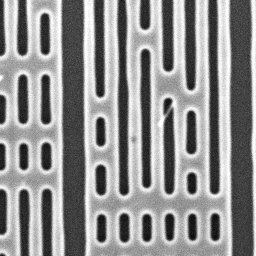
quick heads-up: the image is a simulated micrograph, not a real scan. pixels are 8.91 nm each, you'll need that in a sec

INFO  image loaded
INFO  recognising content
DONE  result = groups of lines, slits or small figures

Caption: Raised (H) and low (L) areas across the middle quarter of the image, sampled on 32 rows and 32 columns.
LLLLLHHHLLHHHLLLHHHLLLHHHLLLHHLL
LLLLLHHHLLHHHLLLHHHLLLHHHLLHHHLL
LLLLLHHHLLHHHLLLHHHLLLHHHHHHHHLL
LLLLLHHHLLHHHLLLHHHLLLHHHHHHHHLL
LLLLLHHHLLHHHLLLHHHLLLHHHHHHHHLL
LLLLLHHHLLHHHLLLHHHLLLHHHHHHHHHL
LLLLLHHHLLHHHLLLHHHLLLHHHHHHHHHL
LLLLLHHHLLHHHLLLHHHLLLHHHHHHHHHH
LLLLLHHHHHHHHLLLHHHLLLHHHLLHHHHH
LLLLLHHHHHHHHLLLHHHLLLHHHLLHHHHH
LLLLLHHHHHHHHLLLHHHLLLHHHLLHHHHH
LLLLLHHHHHHHHLLLHHHLLLHHHLLLHHHH
LLLLLHHHHHHHHLLLHHHLLLHHHLLLHHHL
LLLLLHHHLLHHHLLLHHHLLLHHHLLLHHHL
LLLLLHHHLLHHHLLLHHHLLLHHHLLLHHHL
LLLLLHHHLLHHHLLLHHHLLLHHHLLLHHLL
LLLLLHHHLLLHHLLLHHHLLLHHHLLLHHLL
LLLLLHHHLLLHHLLLHHHLLLHHHLLLHHLL
LLLLLHHHLLLHHLLLHHHLLLHHHLLLHHLL
LLLLLHHHLLHHHLLLHHHLLLHHHLLLHHLL
LLLLLHHHLLHHHLLLHHHLLLHHHLLLHHLL
LLLLLLHHHHHHHLLLHHHLLLHHHLLLHHHL
LLLLLLHHHHHHHLLLHHHLLLHHHLLLHHHL
LLLLLLHHHHHHHLLLHHHLLLHHHLLLHHHH
LLLLLLHHHHHHHLLLHHHLLLHHHLLLHHHH
LLLLLLHHLLHHHLLLHHHLLLHHHLLLHHHH
LLLLLLHHLLLHHLLLHHHLLLHHHLLLHHHH
LLLLLLHHLLLHHLLLHHHLLLHHHLLLHHHL
LLLLLLHHLLLHHLLLHHHLLLHHHLLLHHHL
LLLLLLHHLLLHHLLLHHHLLLHHHLLLHHHL
LLLLLLHHLLLHHLLLHHHLLLHHHLLLHHHL
LLLLLLHHLLLHHLLLHHHHHHHHHLLLHHHL